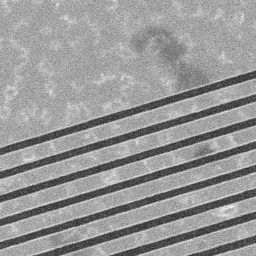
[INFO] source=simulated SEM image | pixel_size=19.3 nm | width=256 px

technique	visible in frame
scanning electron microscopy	parallel lines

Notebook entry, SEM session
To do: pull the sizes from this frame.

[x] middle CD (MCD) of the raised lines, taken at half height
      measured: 284 nm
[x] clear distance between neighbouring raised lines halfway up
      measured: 152 nanometres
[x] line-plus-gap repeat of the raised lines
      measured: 22.5 px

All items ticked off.